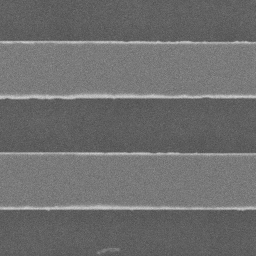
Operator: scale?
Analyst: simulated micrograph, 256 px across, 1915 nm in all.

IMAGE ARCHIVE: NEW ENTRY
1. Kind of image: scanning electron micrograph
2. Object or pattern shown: lines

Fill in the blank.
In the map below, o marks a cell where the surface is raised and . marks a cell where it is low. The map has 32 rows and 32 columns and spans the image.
................................
................................
................................
................................
................................
oooooooooooooooooooooooooooooooo
oooooooooooooooooooooooooooooooo
oooooooooooooooooooooooooooooooo
oooooooooooooooooooooooooooooooo
oooooooooooooooooooooooooooooooo
oooooooooooooooooooooooooooooooo
oooooooooooooooooooooooooooooooo
................................
................................
................................
................................
................................
................................
................................
oooooooooooooooooooooooooooooooo
oooooooooooooooooooooooooooooooo
oooooooooooooooooooooooooooooooo
oooooooooooooooooooooooooooooooo
oooooooooooooooooooooooooooooooo
oooooooooooooooooooooooooooooooo
oooooooooooooooooooooooooooooooo
................................
................................
................................
................................
................................
................................